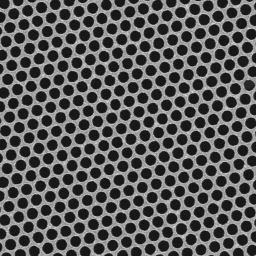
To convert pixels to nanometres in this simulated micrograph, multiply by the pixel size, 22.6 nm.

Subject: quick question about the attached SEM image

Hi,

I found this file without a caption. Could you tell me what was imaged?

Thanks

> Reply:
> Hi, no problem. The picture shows a regular array of holes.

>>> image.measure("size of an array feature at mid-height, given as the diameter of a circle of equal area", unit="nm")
257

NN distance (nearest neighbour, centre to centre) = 0.316 µm